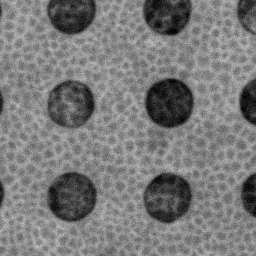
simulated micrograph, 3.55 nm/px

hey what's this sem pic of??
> holes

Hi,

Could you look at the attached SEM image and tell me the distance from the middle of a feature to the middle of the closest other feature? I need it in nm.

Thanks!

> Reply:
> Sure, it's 331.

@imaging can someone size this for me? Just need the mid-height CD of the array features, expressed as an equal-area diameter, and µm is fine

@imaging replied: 0.176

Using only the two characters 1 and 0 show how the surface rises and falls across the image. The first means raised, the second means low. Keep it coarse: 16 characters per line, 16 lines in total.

1110001110001110
1110001110001110
1111111111111111
1111111111111111
1111111111111111
1110001110001110
1110001110001110
1110001110001110
1111111111111111
1111111111111111
1111111111111111
1110001110001110
1110001110001110
1111011110011111
1111111111111111
1111111111111111